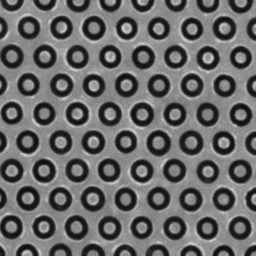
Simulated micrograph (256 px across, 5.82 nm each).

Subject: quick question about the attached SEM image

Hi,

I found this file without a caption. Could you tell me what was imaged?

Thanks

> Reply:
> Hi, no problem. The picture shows a regular array of ring-shaped grooves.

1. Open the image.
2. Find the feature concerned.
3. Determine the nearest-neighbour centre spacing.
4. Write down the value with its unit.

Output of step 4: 0.187 micrometres